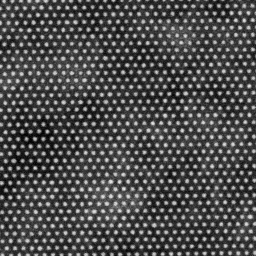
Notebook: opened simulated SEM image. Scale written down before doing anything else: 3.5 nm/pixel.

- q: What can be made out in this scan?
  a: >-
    a regular array of raised bodies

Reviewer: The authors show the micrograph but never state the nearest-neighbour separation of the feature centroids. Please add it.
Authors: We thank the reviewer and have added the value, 28.4 nanometers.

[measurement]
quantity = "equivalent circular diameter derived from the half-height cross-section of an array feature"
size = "0.0125 microns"